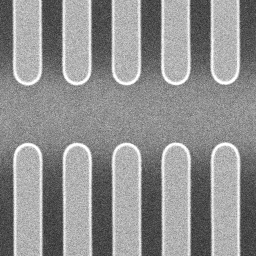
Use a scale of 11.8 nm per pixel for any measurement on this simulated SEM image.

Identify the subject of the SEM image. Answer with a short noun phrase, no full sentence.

groups of lines, slits or small figures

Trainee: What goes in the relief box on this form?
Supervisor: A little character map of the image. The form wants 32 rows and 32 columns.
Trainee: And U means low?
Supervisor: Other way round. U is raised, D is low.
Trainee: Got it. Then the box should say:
DDUUUDDDUUUDDDUUUDDDUUUUDDUUUUDD
DDUUUDDDUUUDDDUUUDDDUUUUDDUUUUDD
DDUUUDDDUUUDDDUUUDDDUUUUDDUUUUDD
DDUUUDDDUUUDDDUUUDDDUUUUDDUUUUDD
DDUUUDDDUUUDDDUUUDDDUUUUDDUUUUDD
DDUUUDDDUUUDDDUUUDDDUUUUDDUUUUDD
DDUUUDDDUUUDDDUUUDDDUUUUDDUUUUDD
DDUUUDDDUUUDDDUUUDDDUUUUDDUUUUDD
DDUUUDDDUUUDDDUUUDDDUUUUDDUUUUDD
DDUUUDDDUUUDDDUUUDDDUUUDDDDUUUDD
DDDDDDDDDDDDDDDDDDDDDDDDDDDDDDDD
DDDDDDDDDDDDDDDDDDDDDDDDDDDDDDDD
DDDDDDDDDDDDDDDDDDDDDDDDDDDDDDDD
DDDDDDDDDDDDDDDDDDDDDDDDDDDDDDDD
DDDDDDDDDDDDDDDDDDDDDDDDDDDDDDDD
DDDDDDDDDDDDDDDDDDDDDDDDDDDDDDDD
DDDDDDDDDDDDDDDDDDDDDDDDDDDDDDDD
DDDDDDDDDDDDDDDDDDDDDDDDDDDDDDDD
DDUUUDDDDUUDDDDUUDDDDUUDDDDUUDDD
DDUUUDDDUUUDDDUUUDDDUUUUDDDUUUDD
DDUUUDDDUUUDDDUUUUDDUUUUDDDUUUDD
DDUUUDDDUUUDDDUUUUDDUUUUDDDUUUDD
DDUUUDDDUUUDDDUUUUDDUUUUDDDUUUDD
DDUUUDDDUUUDDDUUUUDDUUUUDDDUUUDD
DDUUUDDDUUUDDDUUUUDDUUUUDDDUUUDD
DDUUUDDDUUUDDDUUUUDDUUUUDDDUUUDD
DDUUUDDDUUUDDDUUUUDDUUUUDDDUUUDD
DDUUUDDDUUUDDDUUUUDDUUUUDDDUUUDD
DDUUUDDDUUUDDDUUUUDDUUUUDDDUUUDD
DDUUUDDDUUUDDDUUUUDDUUUUDDDUUUDD
DDUUUDDDUUUDDDUUUUDDUUUUDDDUUUDD
DDUUUDDDUUUDDDUUUUDDUUUUDDDUUUDD